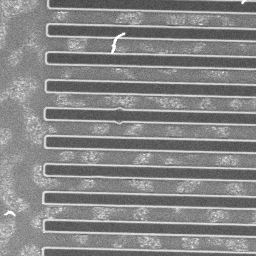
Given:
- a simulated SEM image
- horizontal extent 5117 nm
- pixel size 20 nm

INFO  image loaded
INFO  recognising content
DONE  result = parallel lines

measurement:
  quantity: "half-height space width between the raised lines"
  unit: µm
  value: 0.31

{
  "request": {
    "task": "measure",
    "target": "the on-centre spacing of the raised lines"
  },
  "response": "28 px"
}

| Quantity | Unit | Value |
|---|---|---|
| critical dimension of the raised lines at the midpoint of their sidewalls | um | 0.252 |